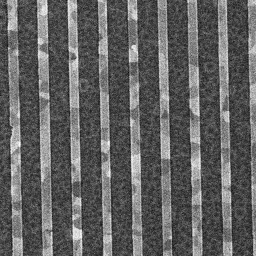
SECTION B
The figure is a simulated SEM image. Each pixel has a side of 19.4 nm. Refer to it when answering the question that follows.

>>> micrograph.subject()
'parallel lines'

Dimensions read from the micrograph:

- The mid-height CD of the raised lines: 7.87 pixels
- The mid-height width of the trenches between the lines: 425 nm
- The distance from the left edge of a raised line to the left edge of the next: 0.583 µm